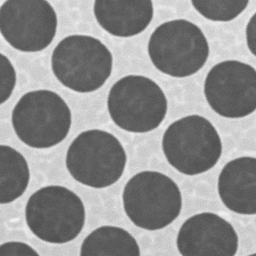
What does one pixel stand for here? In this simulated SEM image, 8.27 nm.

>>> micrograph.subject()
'a regular array of holes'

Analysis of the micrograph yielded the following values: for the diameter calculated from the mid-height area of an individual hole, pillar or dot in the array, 493 nm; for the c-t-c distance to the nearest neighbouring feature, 566 nm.